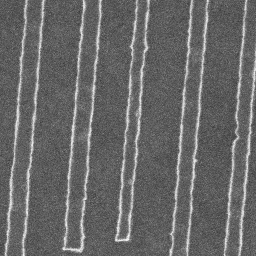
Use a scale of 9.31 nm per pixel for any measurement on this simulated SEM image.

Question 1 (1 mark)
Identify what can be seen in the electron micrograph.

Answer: parallel lines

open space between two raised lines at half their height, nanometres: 358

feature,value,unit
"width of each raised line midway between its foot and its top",155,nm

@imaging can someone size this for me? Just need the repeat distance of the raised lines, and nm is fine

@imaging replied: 507